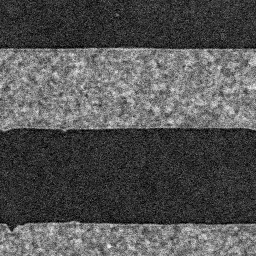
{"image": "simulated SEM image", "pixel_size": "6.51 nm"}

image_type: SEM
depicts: one or a few lines or trenches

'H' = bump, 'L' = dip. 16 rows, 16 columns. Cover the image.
LLLLLLLLLLLLLLLL
LLLLLLLLLLLLLLLL
LLLLLLLLLLLLLLLL
HHHHHHHHHHHHHHHH
HHHHHHHHHHHHHHHH
HHHHHHHHHHHHHHHH
HHHHHHHHHHHHHHHH
HHHHHHHHHHHHHHHH
LLLLLLLLLLLLLLLL
LLLLLLLLLLLLLLLL
LLLLLLLLLLLLLLLL
LLLLLLLLLLLLLLLL
LLLLLLLLLLLLLLLL
LLLLLLLLLLLLLLLL
HHHHHHHHHHHHHHHH
HHHHHHHHHHHHHHHH